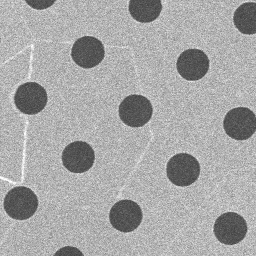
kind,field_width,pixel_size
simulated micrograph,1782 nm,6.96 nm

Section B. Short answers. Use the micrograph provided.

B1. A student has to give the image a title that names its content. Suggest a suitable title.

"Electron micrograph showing a regular array of holes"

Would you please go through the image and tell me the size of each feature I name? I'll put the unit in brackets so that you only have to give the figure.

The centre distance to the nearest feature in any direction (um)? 0.512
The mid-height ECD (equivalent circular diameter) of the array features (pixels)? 33.6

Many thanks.